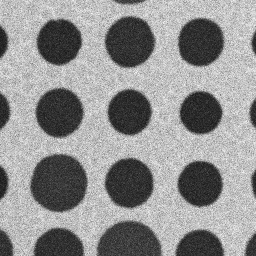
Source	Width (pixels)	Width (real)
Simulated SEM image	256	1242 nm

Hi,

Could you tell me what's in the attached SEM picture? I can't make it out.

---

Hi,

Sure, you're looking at a regular array of holes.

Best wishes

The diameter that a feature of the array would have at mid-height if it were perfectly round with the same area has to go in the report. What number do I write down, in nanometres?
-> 230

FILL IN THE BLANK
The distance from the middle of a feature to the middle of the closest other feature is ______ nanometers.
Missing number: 341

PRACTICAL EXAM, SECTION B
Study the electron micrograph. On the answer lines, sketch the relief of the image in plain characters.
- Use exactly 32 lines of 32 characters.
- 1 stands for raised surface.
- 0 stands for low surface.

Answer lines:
11111111111111100111111111111111
11111111111111111111111111111111
11111110111111100011111100111111
11111000001111000001111000001111
01111000001110000001110000001111
01111000001110000001110000001110
01111000001110000001110000001111
11111100011111000011111000011111
11111111111111111111111111111111
11111111111111111111111111111111
11111111111111111111111111111111
11111100011111100111111100111111
01111000001111000011111000011111
01111000001111000001111000001110
01111000001111000001110000001110
01111000001111000001111000011111
11111100011111100111111100111111
11111111111111111111111111111111
11111111111111111111111111111111
11111100011111111111111111111111
11111000001111000011111100011111
01110000000110000001111000011111
01110000000110000001110000001110
01110000000110000001110000001111
11110000000111000001111000011111
11111000001111100011111100111111
11111111111111111111111111111111
11111111111111111111111111111111
11111110111111000001111111111111
01111000001110000000111000011111
00110000001100000000110000001110
00110000000100000000110000001110